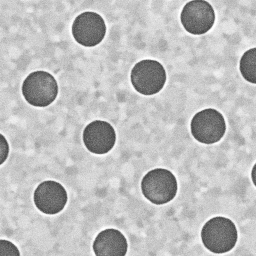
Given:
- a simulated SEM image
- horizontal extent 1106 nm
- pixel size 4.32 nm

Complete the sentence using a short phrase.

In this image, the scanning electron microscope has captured a regular array of holes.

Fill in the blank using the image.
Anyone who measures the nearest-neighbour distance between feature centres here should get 76.9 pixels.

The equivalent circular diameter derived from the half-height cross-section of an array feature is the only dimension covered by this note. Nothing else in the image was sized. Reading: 159 nm